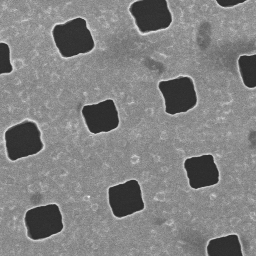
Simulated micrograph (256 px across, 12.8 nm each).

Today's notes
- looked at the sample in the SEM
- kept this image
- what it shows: holes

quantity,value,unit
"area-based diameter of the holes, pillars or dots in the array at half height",464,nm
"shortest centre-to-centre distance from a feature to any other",1030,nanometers